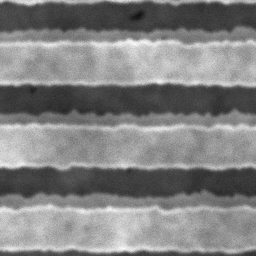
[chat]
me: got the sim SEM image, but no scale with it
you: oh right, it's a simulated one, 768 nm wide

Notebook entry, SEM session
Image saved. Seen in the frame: lines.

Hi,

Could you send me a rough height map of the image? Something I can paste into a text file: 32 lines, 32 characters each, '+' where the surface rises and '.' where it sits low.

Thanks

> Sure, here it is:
...+............................
................................
................................
..............................+.
++++++++++++++++++++++++++++++++
++++++++++++++++++++++++++++++++
++++++++++++++++++++++++++++++++
++++++++++++++++++++++++++++++++
++++++++++++++++++++++++++++++++
++++++++++++++++++++++++++++++++
.++...+...+++..+++.....+.+++++++
................................
................................
................................
++++.+++++++.++++.+++++.++++++++
++++++++++++++++++++++++++++++++
++++++++++++++++++++++++++++++++
++++++++++++++++++++++++++++++++
++++++++++++++++++++++++++++++++
++++++++++++++++++++++++++++++++
++++++++++++++++++++++++++++++++
................................
................................
................................
.++.+++.++.+++........+++++..++.
++++++++++++++++++++++++++++++++
++++++++++++++++++++++++++++++++
++++++++++++++++++++++++++++++++
++++++++++++++++++++++++++++++++
++++++++++++++++++++++++++++++++
++++++++++++++++++++++++++++++++
............++.........+....++..